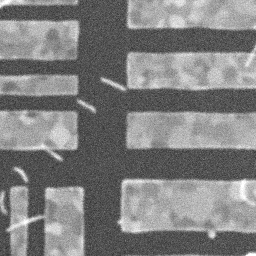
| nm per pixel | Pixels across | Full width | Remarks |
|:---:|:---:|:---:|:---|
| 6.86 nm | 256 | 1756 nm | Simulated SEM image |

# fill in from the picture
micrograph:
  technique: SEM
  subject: groups of lines, slits or small figures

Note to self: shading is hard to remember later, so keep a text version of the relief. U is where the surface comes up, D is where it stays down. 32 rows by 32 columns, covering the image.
UUUUUUUUUDDDDDDDUUUUUUUUUUUUUUUU
DDDDDDDDDDDDDDDDUUUUUUUUUUUUUUUU
DDDDDDDDDDDDDDDDUUUUUUUUUUUUUUUU
UUUUUUUUUUDDDDDDDDDDDDDDDDDDUUUD
UUUUUUUUUUDDDDDDDDDDDDDDDDDDDDDD
UUUUUUUUUUDDDDDDDDDDDDDDDDDDDDDD
UUUUUUUUUUDDDDDDDDDDDDDDDDDDDDDD
DDDDDDDDDDDDDDDDUUUUUUUUUUUUUUUU
DDDDDDDDDDDDDDDDUUUUUUUUUUUUUUUU
DDDUUUUDDDDDDDDDUUUUUUUUUUUUUUUU
UUUUUUUUUUDDDDDDUUUUUUUUUUUUUUUU
UUUUUUUUUDDDDDDDDDDDDDDDDDDDDDDD
DDDDDDDDDDDDDDDDDDDDDDDDDDDDDDDD
DDDDDDDDDDDDDDDDDDDDDDDDDDDDDDDD
UUUUUUUUUUDDDDDDUUUUUUUUUUUUUUUU
UUUUUUUUUUDDDDDDUUUUUUUUUUUUUUUU
UUUUUUUUUUDDDDDDUUUUUUUUUUUUUUUU
UUUUUUUUUUDDDDDDUUUUUUUUUUUUUUUU
UUUUUUUUUDDDDDDDUDDDDDDDDDDDDDUU
DDDDDDDDDDDDDDDDDDDDDDDDDDDDDDDD
DDDDDDDDDDDDDDDDDDDDDDDDDDDDDDDD
DDDDDDDDDDDDDDDDDDDDDDDDDDDDDDDD
DDDDDDDDDDDDDDDDDDDDDDDDDDDDDDDD
DDUDDDDDDDDDDDDUUUUUUUUUUUUUUUUU
DUUDDDUUUUDDDDDUUUUUUUUUUUUUUUUU
DUUDDDUUUUDDDDDUUUUUUUUUUUUUUUUU
DUUDDDUUUUDDDDDUUUUUUUUUUUUUUUUU
DUUUDUUUUUDDDDDUUUUUUUUUUUUUUUUU
DUUDDDUUUUDDDDDUUUUUUUUUUUUUUUUU
DUUDDDUUUUDDDDDDDDDDDDDDDDUDDDDD
DUUDDDUUUUDDDDDDDDDDDDDDDDDDDDDD
DUUDDDUUUUDDDDDDDDDDDDDDDDDDDDDD